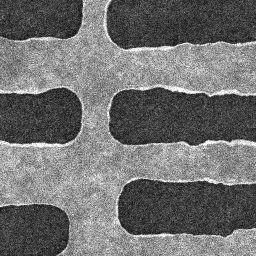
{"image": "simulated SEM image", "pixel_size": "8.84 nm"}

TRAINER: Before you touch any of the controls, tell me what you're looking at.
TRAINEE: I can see holes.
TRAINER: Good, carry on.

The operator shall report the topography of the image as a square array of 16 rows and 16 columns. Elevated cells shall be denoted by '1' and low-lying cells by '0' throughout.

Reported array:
0000011000000000
0000011000000000
1111111000000000
1111111111111111
1111111111111111
1111111110011111
0000011000000000
0000011000000000
0000011000000000
1111111111111111
1111111111111111
1111111100000010
1111111000000000
0000111000000000
0000111100000001
0000111111111111